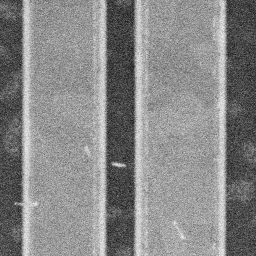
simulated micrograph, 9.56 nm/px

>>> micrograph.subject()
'one or a few lines or trenches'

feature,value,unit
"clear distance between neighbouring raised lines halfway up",354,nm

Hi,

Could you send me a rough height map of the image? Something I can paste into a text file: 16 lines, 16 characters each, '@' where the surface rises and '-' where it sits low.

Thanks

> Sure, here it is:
--@@@@---@@@@@--
--@@@@---@@@@@--
--@@@@---@@@@@--
--@@@@---@@@@@--
--@@@@---@@@@@--
--@@@@---@@@@@--
--@@@@---@@@@@--
--@@@@---@@@@@--
--@@@@---@@@@@--
--@@@@---@@@@@--
--@@@@---@@@@@--
--@@@@---@@@@@--
--@@@@---@@@@@--
--@@@@---@@@@@--
--@@@@---@@@@@--
--@@@@---@@@@@--